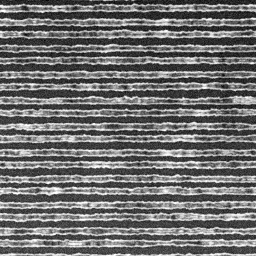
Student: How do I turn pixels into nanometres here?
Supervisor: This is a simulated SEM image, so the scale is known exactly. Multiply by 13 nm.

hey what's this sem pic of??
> parallel lines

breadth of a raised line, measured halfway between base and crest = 76.3 nm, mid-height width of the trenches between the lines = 7.25 px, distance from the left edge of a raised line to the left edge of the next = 0.17 microns